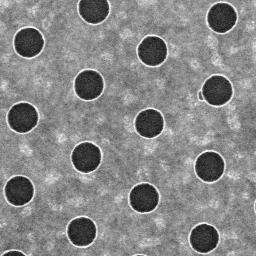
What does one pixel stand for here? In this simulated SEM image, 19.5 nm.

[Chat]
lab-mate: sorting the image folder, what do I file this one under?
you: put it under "a regular array of holes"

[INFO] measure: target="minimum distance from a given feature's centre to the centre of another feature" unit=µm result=1.4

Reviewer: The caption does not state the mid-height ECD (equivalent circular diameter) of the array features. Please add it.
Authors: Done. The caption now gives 596 nanometres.